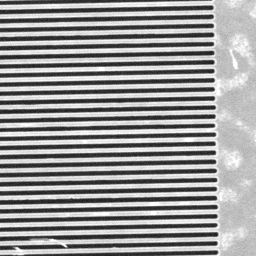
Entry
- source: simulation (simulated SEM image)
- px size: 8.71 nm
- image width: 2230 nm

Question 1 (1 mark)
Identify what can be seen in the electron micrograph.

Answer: parallel lines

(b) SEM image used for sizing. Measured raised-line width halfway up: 0.0359 micrometres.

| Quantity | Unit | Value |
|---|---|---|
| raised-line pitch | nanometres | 79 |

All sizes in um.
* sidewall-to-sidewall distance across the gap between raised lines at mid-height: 0.0436